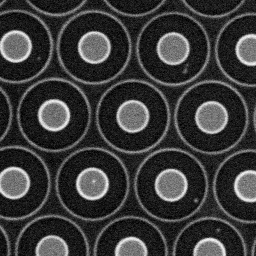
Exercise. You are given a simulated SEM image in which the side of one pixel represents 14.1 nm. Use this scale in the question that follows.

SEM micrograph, an array of small figures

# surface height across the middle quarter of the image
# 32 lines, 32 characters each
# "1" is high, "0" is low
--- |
00000000000000011111000000000000
10000000000000111111000000000000
10000000000001111111100000000000
11100000000011111111110000000000
01111100001111110001111100000011
00011111111110000000001111111111
00001111111000000000000111111110
00000111110000000000000011111100
00000111110000000000000001111000
00000011100000011100000001111000
00000011100000111111000000110000
10000011000000111111100000110000
10000011000001111111100000110000
10000011000001111111100000110000
10000011000000111111100000110000
00000011100000111111000000110000
00000111100000011110000000111000
00000111110000000000000001111000
00001111110000000000000011111100
00011111111000000000000111111110
00111111111100000000001111111111
11111000011111100000111110001111
11000000000011111111110000000001
10000000000001111111100000000000
00000000000000111111000000000000
00000000000000011110000000000000
00000111100000011110000001100000
00001111110000011100000011111100
00001111111000001100000111111100
00011111111000001100000111111110
00011111111000001100000111111110
00001111111000001100000111111100